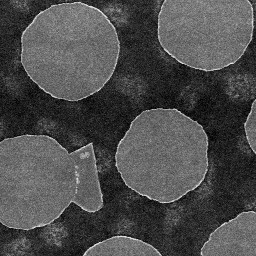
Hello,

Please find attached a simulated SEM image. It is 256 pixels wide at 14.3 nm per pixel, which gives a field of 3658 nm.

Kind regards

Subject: raised bodies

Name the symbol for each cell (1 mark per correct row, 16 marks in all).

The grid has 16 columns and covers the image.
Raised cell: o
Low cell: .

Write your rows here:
...ooo....oooooo
..ooooo...oooooo
.oooooo...oooooo
.oooooo....oooo.
..ooooo.........
...ooo..........
................
........oooo...o
.oo.....ooooo..o
oooooo.oooooo...
oooooo.oooooo...
oooooo..oooo....
oooooo....o.....
oooo...........o
.............ooo
......oooo...ooo